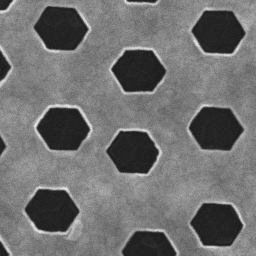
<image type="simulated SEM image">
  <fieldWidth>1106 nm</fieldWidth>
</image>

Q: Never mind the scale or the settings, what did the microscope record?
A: a regular array of holes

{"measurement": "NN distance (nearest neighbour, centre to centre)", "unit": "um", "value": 0.364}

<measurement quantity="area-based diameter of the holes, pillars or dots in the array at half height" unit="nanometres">202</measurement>